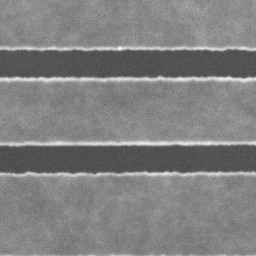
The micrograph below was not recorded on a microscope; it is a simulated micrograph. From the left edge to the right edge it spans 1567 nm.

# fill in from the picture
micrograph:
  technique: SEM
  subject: lines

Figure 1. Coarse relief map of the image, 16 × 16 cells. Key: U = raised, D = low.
UUUUUUUUUUUUUUUU
UUUUUUUUUUUUUUUU
UUUUUUUUUUUUUUUU
DDDDDDDDDDDDDDDD
DDDDDDDDDDDDDDDD
UUUUUUUUUUUUUUUU
UUUUUUUUUUUUUUUU
UUUUUUUUUUUUUUUU
UUUUUUUUUUUUUUUU
DDDDDDDDDDDDDDDD
DDDDDDDDDDDDDDDD
UUUUUUUUUUUUUUUU
UUUUUUUUUUUUUUUU
UUUUUUUUUUUUUUUU
UUUUUUUUUUUUUUUU
UUUUUUUUUUUUUUUU